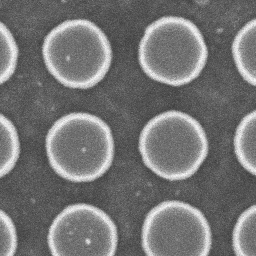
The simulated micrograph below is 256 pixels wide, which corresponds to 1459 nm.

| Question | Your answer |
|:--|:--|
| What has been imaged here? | raised bodies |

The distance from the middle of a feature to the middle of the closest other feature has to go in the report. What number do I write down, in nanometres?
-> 534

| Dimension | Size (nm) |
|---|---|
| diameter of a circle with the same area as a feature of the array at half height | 365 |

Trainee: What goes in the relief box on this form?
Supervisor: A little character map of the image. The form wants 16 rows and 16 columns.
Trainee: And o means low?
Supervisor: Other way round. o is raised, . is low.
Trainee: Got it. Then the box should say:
................
....oo....oo....
o..oooo..oooo..o
o..oooo..oooo..o
o..ooo...ooo...o
................
................
....oo....oo...o
o..oooo..oooo..o
o..oooo..oooo..o
....ooo...oo....
................
................
....oo...oooo..o
o..oooo..oooo..o
o..oooo..oooo..o